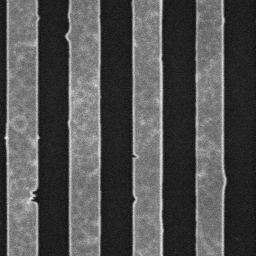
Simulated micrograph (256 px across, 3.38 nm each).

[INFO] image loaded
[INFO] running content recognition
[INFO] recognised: one or a few lines or trenches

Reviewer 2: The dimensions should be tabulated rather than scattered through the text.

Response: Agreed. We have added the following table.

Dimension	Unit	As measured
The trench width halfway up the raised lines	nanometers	116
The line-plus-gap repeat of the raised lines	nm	212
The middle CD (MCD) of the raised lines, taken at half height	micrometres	0.0964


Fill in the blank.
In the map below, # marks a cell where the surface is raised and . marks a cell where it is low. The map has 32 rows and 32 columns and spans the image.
.####....###.....###.....###....
.####....###.....###.....###....
.####....###.....###.....###....
.####....###.....###.....###....
.####...####.....###.....###....
.####....###.....###.....###....
.####....###.....###.....###....
.####....###.....###.....###....
.####....###.....###.....###....
.####....###.....###.....###....
.####....###.....###.....###....
.####....###.....###.....###....
.####....###.....###.....###....
.####....###.....###.....###....
.####....###.....###.....###....
.####....###.....###.....###....
.####....###.....###.....###....
.####....###.....###.....###....
.####....###.....###.....###....
.####....###.....###.....###....
.####....###.....###.....###....
.####....###.....###.....###....
.####....###.....###.....###....
.###.....###.....###.....###....
.###.....###.....###.....###....
.###.....###.....###.....###....
.####....###.....###.....###....
.####....###.....###.....###....
.####....###.....###.....###....
.####....###.....###.....###....
.####....###.....###.....###....
.####....###.....###.....###....